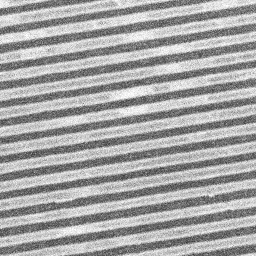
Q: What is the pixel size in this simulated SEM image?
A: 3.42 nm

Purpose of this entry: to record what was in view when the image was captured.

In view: parallel lines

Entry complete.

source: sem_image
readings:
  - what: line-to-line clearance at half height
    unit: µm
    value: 0.0316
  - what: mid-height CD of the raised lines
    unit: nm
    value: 31.6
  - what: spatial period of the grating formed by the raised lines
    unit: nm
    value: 62.1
